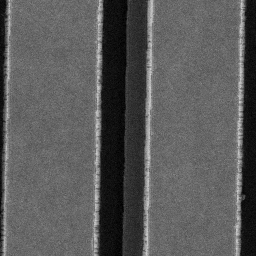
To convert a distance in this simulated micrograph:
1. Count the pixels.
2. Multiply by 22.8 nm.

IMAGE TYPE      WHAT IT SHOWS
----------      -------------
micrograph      lines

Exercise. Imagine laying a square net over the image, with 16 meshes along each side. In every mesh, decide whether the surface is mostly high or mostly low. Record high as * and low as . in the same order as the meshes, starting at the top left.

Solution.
******...******.
******...******.
******...******.
******...******.
******...******.
******...******.
******...******.
******...******.
******...******.
******...******.
******...******.
******...******.
******...******.
******...******.
******...******.
******...******.